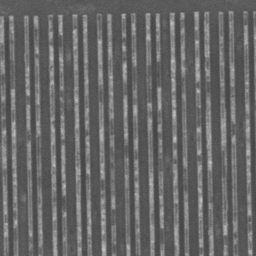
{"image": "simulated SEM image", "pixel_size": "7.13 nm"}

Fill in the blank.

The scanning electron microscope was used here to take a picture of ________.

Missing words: parallel lines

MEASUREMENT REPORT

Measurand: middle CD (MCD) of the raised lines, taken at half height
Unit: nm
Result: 26.7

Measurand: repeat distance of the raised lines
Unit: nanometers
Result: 87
